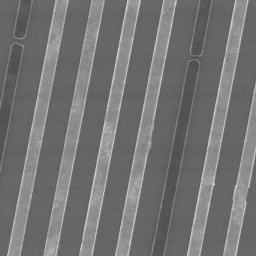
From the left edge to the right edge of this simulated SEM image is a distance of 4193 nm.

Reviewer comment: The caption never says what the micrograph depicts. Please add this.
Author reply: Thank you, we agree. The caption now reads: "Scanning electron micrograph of parallel lines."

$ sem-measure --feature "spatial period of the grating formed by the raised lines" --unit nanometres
579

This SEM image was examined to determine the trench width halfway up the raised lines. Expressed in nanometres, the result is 376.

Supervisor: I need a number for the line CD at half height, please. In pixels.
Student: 11.9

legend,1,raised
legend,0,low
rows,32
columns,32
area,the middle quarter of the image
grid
00001110000001110000001110000001
00001110000001110000001110000001
00011110000001100000001100000011
00011100000011100000011100000011
00011100000011100000011100000011
00011100000011100000011100000011
00011100000011100000011100000011
00011100000011000000011100000111
00111000000111000000111000000111
00111000000111000000111000000111
00111000000111000000111000000111
00111000000111000000111000000111
00111000000111000000111000000111
01111000001110000000110000001110
01110000001110000001110000001110
01110000001110000001110000001110
01110000001110000001110000001110
01110000001110000001110000001110
11110000001100000001110000011110
11100000011100000011110000011100
11100000011100000011110000011100
11100000011100000011100000011100
11100000011100000011100000011100
11100000011000000011100000111100
11000000111000000111000000111000
11000000111000000111000000111000
11000000111000000111000000111000
11000000111000000111000000111000
11000000111000000111000000111000
10000001110000001110000001110000
10000001110000001110000001110000
10000001110000001110000001110000